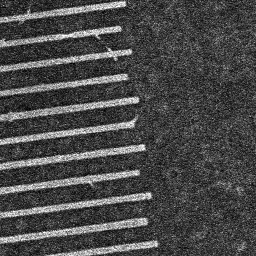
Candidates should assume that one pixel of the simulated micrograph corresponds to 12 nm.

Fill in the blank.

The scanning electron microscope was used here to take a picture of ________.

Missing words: parallel lines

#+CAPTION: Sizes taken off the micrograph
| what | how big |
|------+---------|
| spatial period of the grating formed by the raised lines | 0.292 micrometres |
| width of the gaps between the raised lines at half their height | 0.233 micrometres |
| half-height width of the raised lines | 58.2 nanometres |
